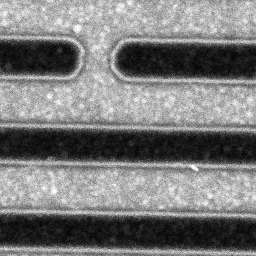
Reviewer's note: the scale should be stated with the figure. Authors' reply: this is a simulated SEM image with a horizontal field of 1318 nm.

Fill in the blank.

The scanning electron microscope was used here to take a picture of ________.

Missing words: one or a few lines or trenches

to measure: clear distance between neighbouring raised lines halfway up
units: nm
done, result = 239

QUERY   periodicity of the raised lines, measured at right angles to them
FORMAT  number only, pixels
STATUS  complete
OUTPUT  86.3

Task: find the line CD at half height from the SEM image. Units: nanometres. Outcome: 205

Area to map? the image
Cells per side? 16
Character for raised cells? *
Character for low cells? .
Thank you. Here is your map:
................
................
*****...*****...
*****..*********
*****..*********
................
................
................
****************
****************
................
................
................
****************
****************
****************